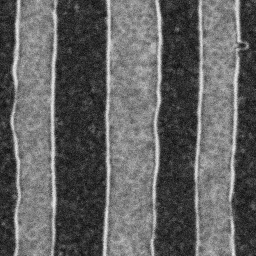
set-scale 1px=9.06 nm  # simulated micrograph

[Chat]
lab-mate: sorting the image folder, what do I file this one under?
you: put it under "one or a few lines or trenches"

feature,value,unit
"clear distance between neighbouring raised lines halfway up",0.332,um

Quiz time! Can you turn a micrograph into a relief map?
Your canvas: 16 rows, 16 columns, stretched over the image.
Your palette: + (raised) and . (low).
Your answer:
+..++++...+++..+
+..++++...+++..+
+..++++...+++..+
+..++++...+++..+
+..++++...+++..+
+..++++...+++..+
+..++++...+++..+
+..++++...++...+
+..++++...++...+
+..++++...++...+
+..++++...++...+
+..++++...++..++
+..++++...++..++
+..++++...++..++
+..++++...++...+
+..++++...++...+